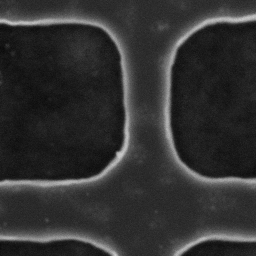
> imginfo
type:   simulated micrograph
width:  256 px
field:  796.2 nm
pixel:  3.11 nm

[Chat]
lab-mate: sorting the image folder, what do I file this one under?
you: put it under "holes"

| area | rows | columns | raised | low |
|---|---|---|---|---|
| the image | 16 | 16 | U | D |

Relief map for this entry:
UUUUUUUUUUUUUUUU
UUUDDUUUUUUUUDDD
DDDDDDDUUUUUDDDD
DDDDDDDDUUUDDDDD
DDDDDDDDUUUDDDDD
DDDDDDDDUUUDDDDD
DDDDDDDDUUUDDDDD
DDDDDDDDUUUDDDDD
DDDDDDDDUUUDDDDD
DDDDDDDUUUUDDDDD
DDDDDDDUUUUUDDDD
UUUUUUUUUUUUUUUU
UUUUUUUUUUUUUUUU
UUUUUUUUUUUUUUUU
UUUUUUUUUUUUUUUU
DDDDDDUUUUUUDDDD